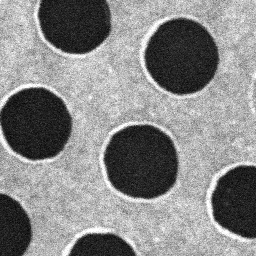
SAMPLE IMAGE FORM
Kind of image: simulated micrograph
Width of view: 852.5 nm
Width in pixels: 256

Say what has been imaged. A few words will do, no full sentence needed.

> holes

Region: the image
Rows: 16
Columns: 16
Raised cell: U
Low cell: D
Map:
UUDDDDDUUUUUUUUU
UUDDDDDUUUDDUUUU
UUUDDDDUUDDDDUUU
UUUUUUUUUDDDDDUU
UUUUUUUUUDDDDUUU
UUDUUUUUUUDDDUUU
DDDDUUUUUUUUUUUU
DDDDUUUUUUUUUUUU
DDDDUUUDDDUUUUUU
UDDDUUUDDDDUUUUU
UUUUUUUDDDDUUUUD
UUUUUUUDDDDUUUDD
DUUUUUUUUUUUUDDD
DDUUUUUUUUUUUDDD
DDUUUUUUUUUUUUDD
DDUUUDDDUUUUUUUU